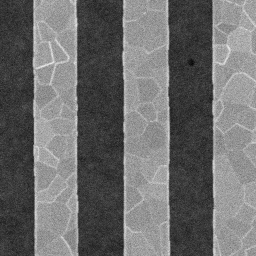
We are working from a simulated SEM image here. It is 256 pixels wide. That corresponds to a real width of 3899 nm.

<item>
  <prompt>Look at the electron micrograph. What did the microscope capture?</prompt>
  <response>wiring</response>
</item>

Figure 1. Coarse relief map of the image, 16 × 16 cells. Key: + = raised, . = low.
..+++...++...+++
..+++...++...+++
..+++...++...+++
..+++...++...+++
..+++...++...+++
..+++...++...+++
..+++...+++..+++
..+++...+++..+++
..+++...+++..+++
..+++...+++..+++
..+++...+++..+++
..+++...+++..+++
..+++...+++..+++
..+++...+++..+++
..+++...+++..+++
..+++...+++..+++